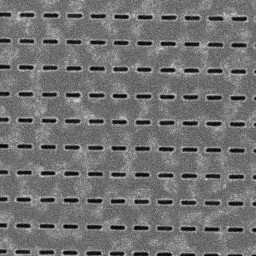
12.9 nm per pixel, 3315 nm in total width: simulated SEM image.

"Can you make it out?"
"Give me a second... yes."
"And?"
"a regular array of holes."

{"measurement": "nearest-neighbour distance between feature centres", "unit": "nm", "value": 302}